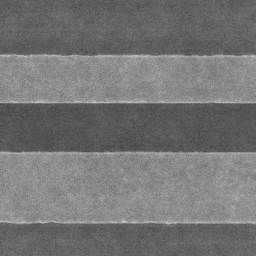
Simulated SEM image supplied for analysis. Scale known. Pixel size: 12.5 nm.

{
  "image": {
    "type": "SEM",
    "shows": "lines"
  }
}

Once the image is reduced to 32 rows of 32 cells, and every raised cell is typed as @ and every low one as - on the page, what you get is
--------------------------------
--------------------------------
--------------------------------
--------------------------------
--------------------------------
--------------------------------
--------------------------------
@@@@@@@@@@@@@@@@@@@@@@@@@@@@@@@@
@@@@@@@@@@@@@@@@@@@@@@@@@@@@@@@@
@@@@@@@@@@@@@@@@@@@@@@@@@@@@@@@@
@@@@@@@@@@@@@@@@@@@@@@@@@@@@@@@@
@@@@@@@@@@@@@@@@@@@@@@@@@@@@@@@@
@@@@@@@@@@@@@@@@@@@@@@@@@@@@@@@@
--------------------------------
--------------------------------
--------------------------------
--------------------------------
--------------------------------
--------------------------------
@@@@@@@@@@@@@@@@@@@@@@@@@@@@@@@@
@@@@@@@@@@@@@@@@@@@@@@@@@@@@@@@@
@@@@@@@@@@@@@@@@@@@@@@@@@@@@@@@@
@@@@@@@@@@@@@@@@@@@@@@@@@@@@@@@@
@@@@@@@@@@@@@@@@@@@@@@@@@@@@@@@@
@@@@@@@@@@@@@@@@@@@@@@@@@@@@@@@@
@@@@@@@@@@@@@@@@@@@@@@@@@@@@@@@@
@@@@@@@@@@@@@@@@@@@@@@@@@@@@@@@@
@@@@@@@@@@@@@@@@@@@@@@@@@@@@@@@@
--------------------------------
--------------------------------
--------------------------------
--------------------------------